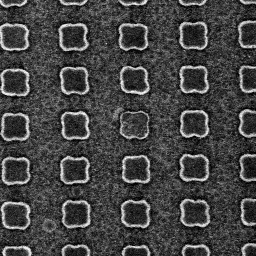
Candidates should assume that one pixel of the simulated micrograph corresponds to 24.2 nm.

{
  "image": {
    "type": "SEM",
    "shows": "a regular array of raised bodies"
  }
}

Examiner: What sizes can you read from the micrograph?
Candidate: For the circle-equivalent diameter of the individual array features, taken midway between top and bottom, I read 682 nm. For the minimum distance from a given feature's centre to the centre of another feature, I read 1.06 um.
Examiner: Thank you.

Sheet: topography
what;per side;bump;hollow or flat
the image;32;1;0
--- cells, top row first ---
11100000110000010000000110000000
00000000000000000000000000000000
00000000000000000000000000000000
11100000111000011100000111000011
11100000111000011100000111000011
11100000111000011100000111000011
00000000000000000000000000000000
00000000000000000000000000000000
00000000100000001100000110000011
11100000111000011100000111000011
11100000111000011100000111000011
11100000111000001100000100000000
00000000000000000000000000000000
00000000000000000000000000000000
01100000111000001100000111000011
11100000111000011100000111000011
11110000111000011100000111000011
00000000000000000000000000000000
00000000000000000000000000000000
00000000000000000000000110000001
11110000111000011110000111000011
11110000111000011110000111000011
11100000111000001100000000000001
00000000000000000000000000000000
00000000000000000000000000000000
01100000111000011100000111000011
11110000111000011110000111000011
11110000111000011110000111000011
00100000000000000000000000000000
00000000000000000000000000000000
00000000000000000000000000000000
11110000111000011110000111000011